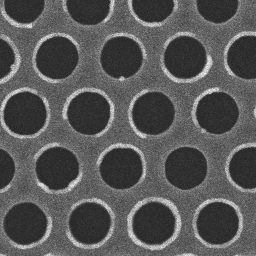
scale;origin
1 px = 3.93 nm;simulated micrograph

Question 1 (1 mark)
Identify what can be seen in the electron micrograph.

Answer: a regular array of holes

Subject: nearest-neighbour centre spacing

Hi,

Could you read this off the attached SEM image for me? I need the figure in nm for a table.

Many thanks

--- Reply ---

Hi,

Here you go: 250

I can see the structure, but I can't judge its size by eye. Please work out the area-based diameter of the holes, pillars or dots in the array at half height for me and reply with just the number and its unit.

167 nanometres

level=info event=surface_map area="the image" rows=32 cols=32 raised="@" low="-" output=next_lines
------@@------@@@-----@@@-----@@
@----@@@@-----@@@----@@@@----@@@
@@--@@@@@----@@@@@--@@@@@@--@@@@
@@@@@@@@@@@@@@@@@@@@@@@@@@@@@@@@
@@@@@@@@@@@@@@@@@@@@@@@@@@@@@@@@
-@@@@----@@@@----@@@@----@@@@---
--@@@-----@@@-----@@@-----@@@---
--@@------@@@-----@@@-----@@----
-@@@@----@@@@-----@@@----@@@@---
-@@@@@---@@@@@--@@@@@@--@@@@@@--
@@@@@@@@@@@@@@@@@@@@@@@@@@@@@@@@
@@@@@@@@@@@@@@@@@@@-@@@@@@@-@@@@
@----@@@@----@@@@----@@@@----@@@
@-----@@@-----@@@-----@@@-----@@
------@@------@@@-----@@------@@
@-----@@@----@@@@----@@@@----@@@
@@---@@@@@---@@@@@---@@@@@--@@@@
@@@@@@@@@@@@@@@@@@@@@@@@@@@@@@@@
@@@@@@--@@@@@@@-@@@@@@--@@@@@@@-
-@@@@----@@@@----@@@@----@@@@---
--@@------@@@-----@@@-----@@@---
--@@------@@@-----@@@-----@@@---
-@@@@----@@@@----@@@@----@@@@---
@@@@@@--@@@@@@--@@@@@@--@@@@@@--
@@@@@@@@@@@@@@@@@@@@@@@@@@@@@@@@
@@--@@@@@@--@@@@@@--@@@@@@--@@@@
@----@@@@----@@@@-----@@@-----@@
@-----@@@-----@@@-----@@@-----@@
@-----@@@-----@@@-----@@@-----@@
@----@@@@----@@@@----@@@@----@@@
@@--@@@@@@@@@@@@@@--@@@@@@@-@@@@
@@@@@@@@@@@@@@@@@@@@@@@@@@@@@@@@